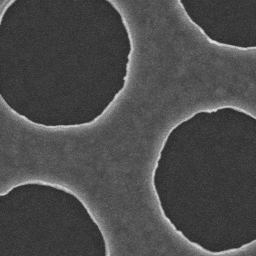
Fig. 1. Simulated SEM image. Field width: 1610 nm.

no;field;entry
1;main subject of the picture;holes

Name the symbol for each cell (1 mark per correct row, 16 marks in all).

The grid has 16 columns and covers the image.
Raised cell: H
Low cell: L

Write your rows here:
HLLLLLLHHHHHLLLL
LLLLLLLLHHHHLLLL
LLLLLLLLHHHHHLLL
LLLLLLLLHHHHHHHH
LLLLLLLLHHHHHHHH
LLLLLLLLHHHHHHHH
LLLLLLLHHHHHHHHH
HHLLLLHHHHHHLLLL
HHHHHHHHHHHLLLLL
HHHHHHHHHHLLLLLL
HHHHHHHHHHLLLLLL
HHLHHHHHHHLLLLLL
LLLLLHHHHHLLLLLL
LLLLLLHHHHLLLLLL
LLLLLLHHHHHLLLLL
LLLLLLLHHHHHHLLH